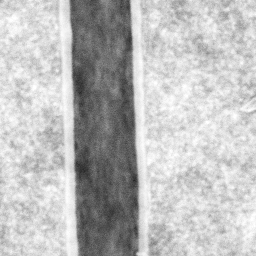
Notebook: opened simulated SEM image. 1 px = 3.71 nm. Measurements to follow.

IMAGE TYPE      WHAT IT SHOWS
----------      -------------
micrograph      one or a few lines or trenches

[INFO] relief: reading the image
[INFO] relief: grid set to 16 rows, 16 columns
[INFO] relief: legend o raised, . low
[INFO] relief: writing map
oooo....oooooooo
oooo.....ooooooo
oooo.....ooooooo
oooo.....ooooooo
oooo.....ooooooo
oooo.....ooooooo
oooo.....ooooooo
oooo.....ooooooo
oooo.....ooooooo
oooo.....ooooooo
oooo.....ooooooo
oooo.....ooooooo
oooo.....ooooooo
oooo.....ooooooo
oooo.....ooooooo
oooo.....ooooooo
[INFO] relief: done